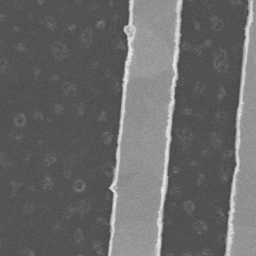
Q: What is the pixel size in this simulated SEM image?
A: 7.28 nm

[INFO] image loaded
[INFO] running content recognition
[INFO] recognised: one or a few lines or trenches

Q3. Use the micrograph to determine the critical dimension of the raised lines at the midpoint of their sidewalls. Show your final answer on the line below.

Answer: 352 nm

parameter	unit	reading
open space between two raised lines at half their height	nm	504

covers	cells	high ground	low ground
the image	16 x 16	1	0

0000000011100000
0000000011100000
0000000011100001
0000000011100001
0000000011100001
0000000011100001
0000000011100001
0000000011100001
0000000011100001
0000000111000001
0000000111000001
0000000111000001
0000000111000011
0000000111000011
0000000111000011
0000000111000011